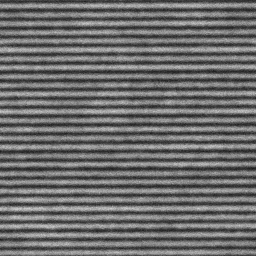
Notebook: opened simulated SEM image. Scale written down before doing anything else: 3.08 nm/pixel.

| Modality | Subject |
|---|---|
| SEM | parallel lines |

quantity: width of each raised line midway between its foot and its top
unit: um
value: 0.0115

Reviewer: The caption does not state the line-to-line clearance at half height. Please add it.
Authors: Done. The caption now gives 0.0173 microns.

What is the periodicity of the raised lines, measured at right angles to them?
27.1 nm